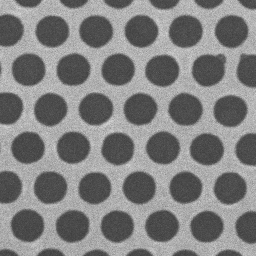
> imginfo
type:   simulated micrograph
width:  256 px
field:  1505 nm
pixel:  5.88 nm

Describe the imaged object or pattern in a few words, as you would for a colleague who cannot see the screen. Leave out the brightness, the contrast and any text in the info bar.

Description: a regular array of holes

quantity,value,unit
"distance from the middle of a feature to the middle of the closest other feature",260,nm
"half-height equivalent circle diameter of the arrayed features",0.193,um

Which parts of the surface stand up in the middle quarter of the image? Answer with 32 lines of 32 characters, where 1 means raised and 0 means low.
00000001110000000011000000000111
00000001100000000011000000000111
00000001110000000011000000000111
00000011110000000111100000001111
00000111111000001111110000001111
10011111111110111111111100111111
11111111111111111111111111111111
11111100001111111100111111111000
11111000000111110000001111100000
11110000000011100000000111100000
01110000000011100000000111000000
01110000000011100000000111000000
01110000000011100000000111000000
11110000000111110000001111100000
11111000001111110000001111110000
11111111111111111111111111111101
11111111111111111111111111111111
00000111111100011111111000011111
00000011110000000111100000001111
00000011110000000111100000000111
00000001110000000011000000000111
00000001100000000111000000000110
00000011100000000111100000000111
00000111110000000111110000001111
00001111111000001111111000011111
11111111111111111111111111111111
11111111111111111111111111111111
11111100001111111000011111110000
11111000000111100000001111100000
01110000000011100000000111100000
01110000000011100000000111000000
01100000000011100000000111000000